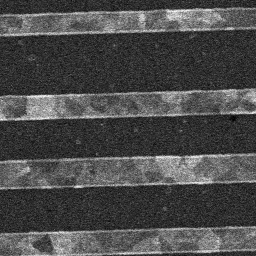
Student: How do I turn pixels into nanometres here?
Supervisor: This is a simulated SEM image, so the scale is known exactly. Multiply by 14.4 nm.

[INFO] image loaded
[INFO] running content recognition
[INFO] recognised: one or a few lines or trenches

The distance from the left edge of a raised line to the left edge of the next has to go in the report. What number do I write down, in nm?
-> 1060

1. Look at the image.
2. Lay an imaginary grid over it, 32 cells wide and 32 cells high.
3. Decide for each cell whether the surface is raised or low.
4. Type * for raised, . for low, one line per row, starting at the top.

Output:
................................
..................**************
********************************
*****************************...
................................
................................
................................
................................
................................
................................
................................
........................**.*****
********************************
********************************
*************.*.................
................................
................................
................................
................................
............................****
********************************
********************************
********************************
*...............................
................................
................................
................................
................................
..............................**
********************************
********************************
*********************...........